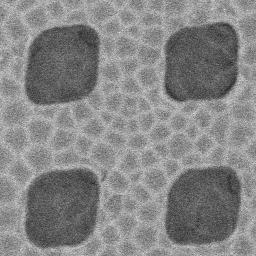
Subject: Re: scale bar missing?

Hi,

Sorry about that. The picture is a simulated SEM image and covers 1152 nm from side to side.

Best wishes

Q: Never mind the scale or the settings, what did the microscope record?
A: holes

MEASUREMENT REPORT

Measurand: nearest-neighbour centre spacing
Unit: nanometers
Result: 631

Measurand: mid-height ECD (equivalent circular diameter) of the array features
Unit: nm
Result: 364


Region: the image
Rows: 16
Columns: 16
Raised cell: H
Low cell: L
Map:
HHHHHHHHHHHHHHHH
HHHHHHHHHHHHHLHH
HHLLLLHHHHLLLLLH
HHLLLLHHHHLLLLLH
HHLLLLHHHHLLLLLH
HHLLLLHHHHLLLLHH
HHLLHHHHHHHHHHHH
HHHHHHHHHHHHHHHH
HHHHHHHHHHHHHHHH
HHHHHHHHHHHHHHHH
HHHHHHHHHHHHHLHH
HHLLLLHHHHHLLLLH
HHLLLLHHHHLLLLLH
HHLLLLHHHHLLLLLH
HHLLLLHHHHLLLLLH
HHHHHHHHHHHHHHHH